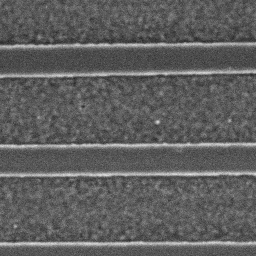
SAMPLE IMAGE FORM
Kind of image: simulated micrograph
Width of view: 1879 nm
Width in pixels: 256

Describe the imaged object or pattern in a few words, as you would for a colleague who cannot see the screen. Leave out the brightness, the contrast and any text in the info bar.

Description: lines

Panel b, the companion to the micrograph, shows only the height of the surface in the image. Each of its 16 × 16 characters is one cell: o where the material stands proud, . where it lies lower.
................
................
................
oooooooooooooooo
oooooooooooooooo
................
................
................
................
oooooooooooooooo
oooooooooooooooo
................
................
................
................
oooooooooooooooo